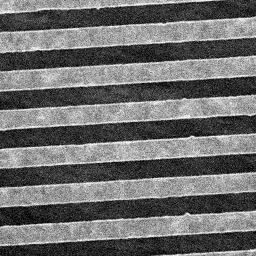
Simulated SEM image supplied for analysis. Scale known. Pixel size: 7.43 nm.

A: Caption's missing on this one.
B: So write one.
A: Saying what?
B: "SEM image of parallel lines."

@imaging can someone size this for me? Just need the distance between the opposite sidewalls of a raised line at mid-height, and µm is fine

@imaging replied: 0.138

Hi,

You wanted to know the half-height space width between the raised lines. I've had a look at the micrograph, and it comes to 19.7 px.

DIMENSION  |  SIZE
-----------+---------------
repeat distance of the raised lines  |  287 nm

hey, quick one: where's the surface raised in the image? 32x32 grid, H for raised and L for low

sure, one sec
HHHHHHHHHHHHHHHHHHLLLLLLLLLLLLLL
LLLLLLLLLLLLLLLLLLLLLLLLLLLLLLLL
LLLLLLLLLLLLLLLLLLLLLLLLLLLLHHHH
LLLLLLLLLLLHHHHHHHHHHHHHHHHHHHHH
HHHHHHHHHHHHHHHHHHHHHHHHHHHHHHHH
HHHHHHHHHHHHHHHHHLLLLLLLLLLLLLLL
HLLLLLLLLLLLLLLLLLLLLLLLLLLLLLLL
LLLLLLLLLLLLLLLLLLLLLLLLLHHHHHHH
LLLLLLLLHHHHHHHHHHHHHHHHHHHHHHHH
HHHHHHHHHHHHHHHHHHHHHHHHHHHHHHLL
HHHHHHHHHHHHHHHLLLLLLLLLLLLLLLLL
LLLLLLLLLLLLLLLLLLLLLLLLLLLLLLLL
LLLLLLLLLLLLLLLLLLLLLLHHHHHHHHHH
LLLLLLHHHHHHHHHHHHHHHHHHHHHHHHHH
HHHHHHHHHHHHHHHHHHHHHHHHHHHLLLLL
HHHHHHHHHHHLLLLLLLLLLLLLLLLLLLLL
LLLLLLLLLLLLLLLLLLLLLLLLLLLLLLLL
LLLLLLLLLLLLLLLLLLLLHHHHHHHHHHHH
LLLLHHHHHHHHHHHLHHHHHHHHHHHHHHHH
HHHHHHHHHHHHHHHHHHHHHHHHLLLLLLLL
HHHHHHHHLLLLLLLLLLLLLLLLLLLLLLLL
LLLLLLLLLLLLLLLLLLLLLLLLLLLLLLLL
LLLLLLLLLLLLLLLLLHHHHHHHHHHHHHHH
LHHHHHHHHHHHHHHHHHHHHHHHHHHHHHHH
HHHHHHHHHHHHHHHHHHHHHHLLLLLLLLLL
HHHHHHLLLLLLLLLLLLLLLLLLLLLLLLLL
LLLLLLLLLLLLLLLLLLLLLLLLLLLLLLLH
LLLLLLLLLLLLLLLHHHHHHHHHHHHHHHHH
HHHHHHHHHHHHHHHHHHHHHHHHHHHHHHHH
HHHHHHHHHHHHHHHHHHHLLLLLLLLLLLLL
HHHLLLLLLLLLLLLLLLLLLLLLLLLLLLLL
LLLLLLLLLLLLLLLLLLLLLLLLLLLLLHHH